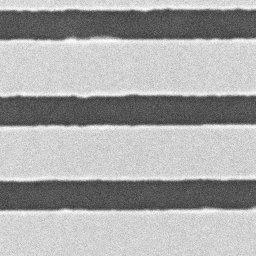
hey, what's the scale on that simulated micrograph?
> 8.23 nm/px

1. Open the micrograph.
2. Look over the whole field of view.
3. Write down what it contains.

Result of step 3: lines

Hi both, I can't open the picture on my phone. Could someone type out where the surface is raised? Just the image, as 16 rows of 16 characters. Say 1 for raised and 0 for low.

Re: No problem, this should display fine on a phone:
1111111111111111
0000000000000000
0000000000000011
1111111111111111
1111111111111111
1111111111111111
0000000000000000
0000000000000000
1111111111111111
1111111111111111
1111111111111111
0000000000000000
0000000000000000
1111111111111111
1111111111111111
1111111111111111